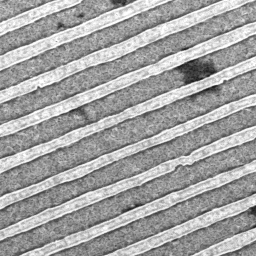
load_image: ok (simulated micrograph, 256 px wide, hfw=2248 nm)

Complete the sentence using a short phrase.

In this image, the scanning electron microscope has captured parallel lines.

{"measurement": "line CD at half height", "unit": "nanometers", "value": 87.4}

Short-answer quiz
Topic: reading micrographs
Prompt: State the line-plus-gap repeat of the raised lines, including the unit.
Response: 280 nanometres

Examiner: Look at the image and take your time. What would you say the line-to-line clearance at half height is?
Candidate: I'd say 192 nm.